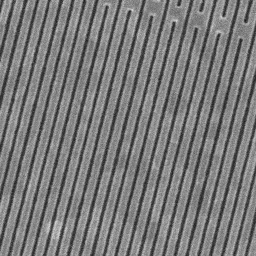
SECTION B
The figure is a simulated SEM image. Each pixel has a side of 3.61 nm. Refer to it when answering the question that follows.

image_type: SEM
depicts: parallel lines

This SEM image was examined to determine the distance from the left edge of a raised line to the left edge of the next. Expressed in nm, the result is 41.4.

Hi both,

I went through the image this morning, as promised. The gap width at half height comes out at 14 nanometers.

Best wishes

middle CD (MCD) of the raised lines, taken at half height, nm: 28